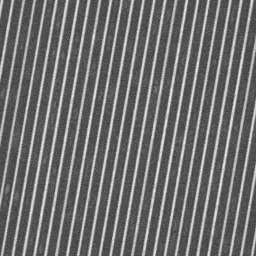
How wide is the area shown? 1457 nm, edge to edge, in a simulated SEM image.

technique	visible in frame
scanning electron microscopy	parallel lines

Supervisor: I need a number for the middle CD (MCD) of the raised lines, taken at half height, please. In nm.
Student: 11.2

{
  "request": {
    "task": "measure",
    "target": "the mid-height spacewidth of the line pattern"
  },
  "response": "49 nm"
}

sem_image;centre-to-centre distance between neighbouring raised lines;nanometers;61